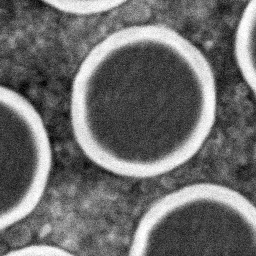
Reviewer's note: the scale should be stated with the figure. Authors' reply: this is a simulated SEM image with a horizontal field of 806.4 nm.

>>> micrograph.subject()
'raised bodies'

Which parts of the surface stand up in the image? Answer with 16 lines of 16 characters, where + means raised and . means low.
................
...............+
.......++++....+
......++++++...+
.....++++++++..+
.....++++++++...
+....++++++++...
++...++++++++...
+++..++++++++...
+++...++++++....
+++.....++......
++..............
++.........++++.
+.........++++++
.........+++++++
.........+++++++